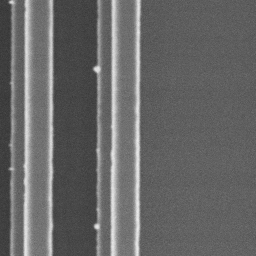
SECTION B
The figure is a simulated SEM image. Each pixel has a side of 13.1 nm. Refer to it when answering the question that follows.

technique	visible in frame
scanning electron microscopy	lines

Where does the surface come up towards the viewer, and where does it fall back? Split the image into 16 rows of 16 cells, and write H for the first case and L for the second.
LHHLLLHHHLLLLLLL
LHHLLLHHHLLLLLLL
LHHLLLHHHLLLLLLL
LHHLLLHHHLLLLLLL
LHHLLLHHHLLLLLLL
LHHLLLHHHLLLLLLL
LHHLLLHHHLLLLLLL
LHHLLLHHHLLLLLLL
LHHLLLHHHLLLLLLL
LHHLLLHHHLLLLLLL
LHHLLLHHHLLLLLLL
LHHLLLHHHLLLLLLL
LHHLLLHHHLLLLLLL
LHHLLLHHHLLLLLLL
LHHLLLHHHLLLLLLL
LHHLLLHHHLLLLLLL